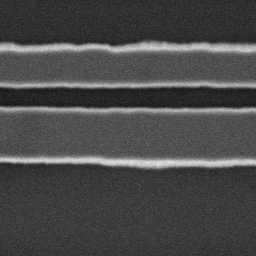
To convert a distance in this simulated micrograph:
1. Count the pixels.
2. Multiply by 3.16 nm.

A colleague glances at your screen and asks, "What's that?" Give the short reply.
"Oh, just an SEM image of lines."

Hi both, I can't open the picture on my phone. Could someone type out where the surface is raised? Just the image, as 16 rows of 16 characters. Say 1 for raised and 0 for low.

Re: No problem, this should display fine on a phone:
0000000000000000
0000000000000000
0000000000000000
1111111111111111
1111111111111111
1111111111111111
1111111111111111
1111111111111111
1111111111111111
1111111111111111
0000000000000000
0000000000000000
0000000000000000
0000000000000000
0000000000000000
0000000000000000